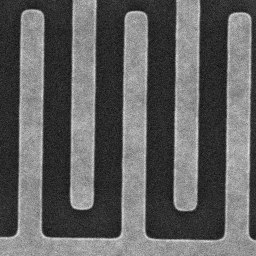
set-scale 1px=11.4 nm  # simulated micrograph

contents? groups of lines, slits or small figures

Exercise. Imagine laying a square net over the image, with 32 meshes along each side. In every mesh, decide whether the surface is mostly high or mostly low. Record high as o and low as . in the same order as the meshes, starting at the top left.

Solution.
.........ooo..........ooo.......
...oo....ooo....oo....ooo.......
...oo....ooo....oo....ooo....oo.
...oo....ooo....oo....ooo....oo.
...oo....ooo....oo....ooo....oo.
...oo....ooo....oo....ooo....oo.
...oo....ooo....oo....ooo....oo.
...oo....ooo....oo....ooo....oo.
...oo....ooo....oo....ooo....oo.
...oo....ooo....oo....ooo....oo.
...oo....ooo...ooo....ooo...ooo.
...oo....ooo...ooo....ooo...ooo.
...oo....ooo...ooo....ooo...ooo.
...oo....ooo...ooo....ooo...ooo.
...oo....ooo...ooo....ooo...ooo.
...oo....ooo...ooo....ooo...ooo.
...oo....ooo...ooo....ooo...ooo.
...oo....ooo...ooo....ooo...ooo.
...oo....ooo...ooo....ooo...ooo.
...oo....ooo...ooo....ooo...ooo.
...oo....ooo...ooo....ooo...ooo.
..ooo....ooo...ooo....ooo...ooo.
..ooo....ooo...ooo....ooo...ooo.
..ooo....ooo...ooo....ooo...ooo.
..ooo....ooo...ooo....ooo...ooo.
..ooo....ooo...ooo....ooo...ooo.
..ooo..........ooo..........ooo.
..ooo..........ooo..........ooo.
..ooo..........ooo..........ooo.
..oooo.........ooo..........ooo.
oooooooooooooooooooooooooooooooo
oooooooooooooooooooooooooooooooo